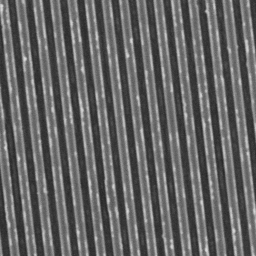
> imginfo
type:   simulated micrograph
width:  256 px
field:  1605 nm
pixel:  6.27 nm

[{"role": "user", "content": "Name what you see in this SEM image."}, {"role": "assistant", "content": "parallel lines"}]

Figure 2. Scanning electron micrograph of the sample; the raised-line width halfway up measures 59.1 nanometres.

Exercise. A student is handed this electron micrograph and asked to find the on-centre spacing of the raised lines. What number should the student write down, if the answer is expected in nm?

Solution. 107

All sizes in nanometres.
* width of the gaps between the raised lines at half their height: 48.2